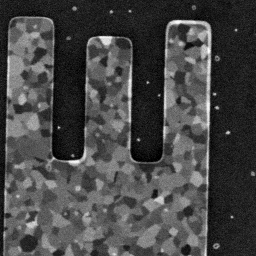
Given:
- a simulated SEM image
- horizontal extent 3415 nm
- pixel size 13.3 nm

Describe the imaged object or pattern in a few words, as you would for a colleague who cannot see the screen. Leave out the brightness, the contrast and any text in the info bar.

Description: groups of lines, slits or small figures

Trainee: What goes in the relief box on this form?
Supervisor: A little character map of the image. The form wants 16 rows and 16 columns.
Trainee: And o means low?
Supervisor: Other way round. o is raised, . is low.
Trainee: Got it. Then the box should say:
................
.oo........oo...
.oo...oo..ooo...
.oo..ooo..ooo...
.oo..ooo..ooo...
ooo..ooo..ooo...
ooo..ooo..ooo...
ooo..ooo..ooo...
ooo..ooo..ooo...
ooo..ooo..ooo...
ooooooooooooo...
ooooooooooooo...
ooooooooooooo...
ooooooooooooo...
ooooooooooooo...
ooooooooooooo...